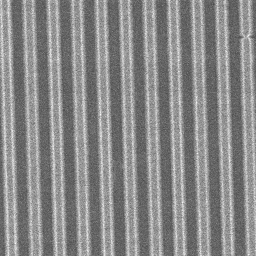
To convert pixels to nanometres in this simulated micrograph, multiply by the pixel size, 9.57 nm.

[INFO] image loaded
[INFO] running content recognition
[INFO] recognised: parallel lines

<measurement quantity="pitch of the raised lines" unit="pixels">24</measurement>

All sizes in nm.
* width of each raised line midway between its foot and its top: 105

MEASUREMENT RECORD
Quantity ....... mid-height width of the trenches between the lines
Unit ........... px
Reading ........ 12.6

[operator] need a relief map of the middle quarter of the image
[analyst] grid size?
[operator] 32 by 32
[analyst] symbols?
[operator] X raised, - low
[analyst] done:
--XXX---XXX----XX---XXX----XX---
--XXX---XXX----XX---XXX----XX---
---XX---XXX----XX---XXX----XX---
---XX---XXX----XX---XXX----XX---
---XX----XX----XX----XX----XX---
---XX----XX----XX----XX----XX---
---XX----XX----XX----XX----XX---
---XX----XX----XX----XX----XX---
---XX----XX----XX----XX----XX---
---XX----XX----XX----XX----XX---
---XX----XX----XX----XX----XX---
---XX----XX----XX----XX----XX---
---XX----XX----XX----XX----XX---
---XX----XX----XX----XX----XX---
---XX----XX----XX----XX----XX---
---XX----XX----XX----XX----XX---
---XX----XX----XX----XX----XX---
---XXX---XX----XXX---XX----XXX--
---XXX---XX----XXX---XX----XXX--
---XXX---XX----XXX---XX----XXX--
---XXX---XX----XXX---XX----XXX--
---XXX---XXX---XXX---XXX---XXX--
---XXX---XXX---XXX---XXX---XXX--
---XXX---XXX---XXX---XXX---XXX--
---XXX---XXX---XXX---XXX---XXX--
---XXX---XXX---XXX---XXX---XXX--
---XXX---XXX---XXX---XXX---XXX--
---XXX---XXX---XXX---XXX---XXX--
---XXX---XXX---XXX---XXX---XXX--
---XXX---XXX---XXX---XXX---XXX--
---XXX---XXX---XXX---XXX---XXX--
---XXX---XXX---XXX---XXX---XXX--